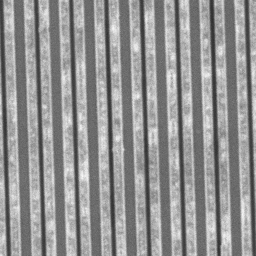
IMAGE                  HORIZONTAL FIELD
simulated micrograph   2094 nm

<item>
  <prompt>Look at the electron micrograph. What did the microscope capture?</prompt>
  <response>parallel lines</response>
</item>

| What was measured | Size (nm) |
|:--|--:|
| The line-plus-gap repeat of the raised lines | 146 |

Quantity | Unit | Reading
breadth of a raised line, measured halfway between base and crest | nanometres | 75.7